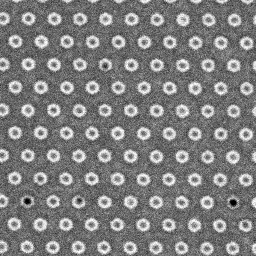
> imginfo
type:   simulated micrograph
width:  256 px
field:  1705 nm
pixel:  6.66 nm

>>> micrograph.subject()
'a regular array of raised bodies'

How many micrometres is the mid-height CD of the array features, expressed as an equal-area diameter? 0.0761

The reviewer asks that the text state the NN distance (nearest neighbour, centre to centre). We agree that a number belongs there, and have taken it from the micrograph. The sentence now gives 171 nanometers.